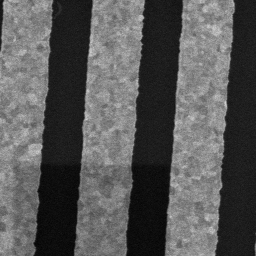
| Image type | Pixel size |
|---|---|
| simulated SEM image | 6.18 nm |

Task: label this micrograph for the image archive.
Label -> lines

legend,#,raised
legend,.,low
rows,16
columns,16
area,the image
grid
###...###..####.
###...###..####.
###...###..####.
###...###..###..
###..####..###..
###..####..###..
###..###...###..
###..###...###..
###..###...###..
###..###...###..
##...###...###..
##...###...###..
##...###...###..
##...###..####..
##...###..####..
##...###..###...